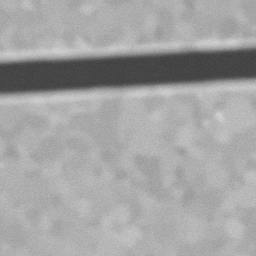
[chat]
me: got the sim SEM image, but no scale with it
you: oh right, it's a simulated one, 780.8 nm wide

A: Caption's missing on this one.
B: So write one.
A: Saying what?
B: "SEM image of one or a few lines or trenches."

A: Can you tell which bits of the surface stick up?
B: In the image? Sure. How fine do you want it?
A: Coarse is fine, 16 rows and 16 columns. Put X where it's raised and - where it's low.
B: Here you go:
XXXXXXXXXXXXXXXX
XXXXXXXXXXXXXXXX
XXXXXXXXXXXXXXXX
XXX-------------
----------------
-----------XXXXX
XXXXXXXXXXXXXXXX
XXXXXXXXXXXXXXXX
XXXXXXXXXXXXXXXX
XXXXXXXXXXXXXXXX
XXXXXXXXXXXXXXXX
XXXXXXXXXXXXXXXX
XXXXXXXXXXXXXXXX
XXXXXXXXXXXXXXXX
XXXXXXXXXXXXXXXX
XXXXXXXXXXXXXXXX